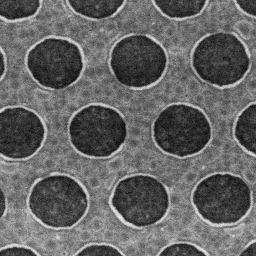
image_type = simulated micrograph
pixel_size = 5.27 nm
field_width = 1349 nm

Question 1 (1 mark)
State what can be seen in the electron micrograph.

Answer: a regular array of holes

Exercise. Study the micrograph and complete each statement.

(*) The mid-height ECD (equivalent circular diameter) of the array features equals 283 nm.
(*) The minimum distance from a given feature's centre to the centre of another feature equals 0.423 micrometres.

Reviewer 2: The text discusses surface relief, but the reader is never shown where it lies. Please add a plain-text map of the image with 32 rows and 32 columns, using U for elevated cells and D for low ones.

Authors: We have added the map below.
DDDDDUUUUDDDDDDUUUUUDDDDDDUUUUDD
DDDDUUUUUUDDDDUUUUUUDDDDDUUUUUUD
UUUUUUUUUUUUUUUUUUUUUUUUUUUUUUUU
UUUUUUUUUUUUUUUUUUUUUUUUUUUUUUUU
UUUUUUUUUUUUUUUUDDUUUUUUUUDDDUUU
UUUUUDDDDUUUUUUDDDDDUUUUUDDDDDUU
UUUUDDDDDDUUUUDDDDDDUUUUDDDDDDDU
UUUDDDDDDDUUUUDDDDDDDUUUDDDDDDDU
DUUUDDDDDDUUUUDDDDDDDUUUDDDDDDDU
UUUUDDDDDDUUUUDDDDDDUUUUUDDDDDUU
UUUUUDDDDUUUUUUDDDDUUUUUUUUDDUUU
UUUUUUUUUUUUUUUUUUUUUUUUUUUUUUUU
UUUUUUUUUUUUUUUUUUUUUUUUUUUUUUUU
UUUUUUUUUUUDDUUUUUUUUDDDUUUUUUUD
DDDDDUUUUDDDDDDUUUUUDDDDDDUUUUDD
DDDDDUUUUDDDDDDDUUUDDDDDDDUUUUDD
DDDDDUUUUDDDDDDDUUUDDDDDDDUUUDDD
DDDDDUUUUDDDDDDDUUUDDDDDDDUUUUDD
DDDDDUUUUUDDDDDUUUUUDDDDDUUUUUUD
UDDDUUUUUUUDDDUUUUUUUUDUUUUUUUUU
UUUUUUUUUUUUUUUUUUUUUUUUUUUUUUUU
UUUUUUUUUUUUUUUUUUUUUUUUUUUUUUUU
UUUUUDDDDUUUUUUDDDDDUUUUUDDDDDUU
UUUUDDDDDDUUUUDDDDDDDUUUUDDDDDDU
DUUUDDDDDDDUUUDDDDDDDUUUDDDDDDDU
DUUUDDDDDDDUUUDDDDDDDUUUDDDDDDDU
UUUUDDDDDDDUUUUDDDDDDUUUUDDDDDDU
UUUUUDDDDDUUUUUUDDDDUUUUUUDDDDUU
UUUUUUUUUUUUUUUUUUUUUUUUUUUUUUUU
UUUUUUUUUUUUUUUUUUUUUUUUUUUUUUUU
UUUUUUUUUUUUUUUUUUUUUUDUUUUUUUUU
DDDDUUUUUUDDDDDUUUUUDDDDDUUUUUDD